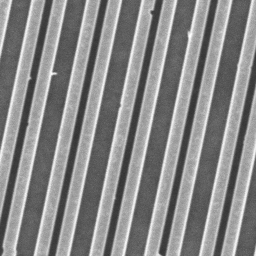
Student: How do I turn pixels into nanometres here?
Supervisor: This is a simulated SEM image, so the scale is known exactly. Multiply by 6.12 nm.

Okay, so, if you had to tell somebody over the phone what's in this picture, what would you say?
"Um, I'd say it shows parallel lines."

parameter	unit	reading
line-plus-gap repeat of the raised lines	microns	0.164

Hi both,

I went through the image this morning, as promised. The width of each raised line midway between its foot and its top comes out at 0.0749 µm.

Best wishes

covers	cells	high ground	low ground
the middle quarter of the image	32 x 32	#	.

..###...###.....###...###.....##
..###...###.....###..####.....##
..###..###......###..###......##
..###..###......###..###.....###
..###..###.....####..###.....###
.###...###.....###...###.....###
.###...###.....###..###......###
.###..###......###..###......###
.###..###......###..###.....###.
.###..###.....###...###.....###.
###...###.....###...###.....###.
###...###.....###..###......###.
###..###......###..###.....####.
###..###......###..###.....###..
###..###.....###...###.....###..
##...###.....###...###.....###..
##...###.....###..###......###..
##..###......###..###.....####..
##..###......###..###.....###...
##..###.....###...###.....###..#
#...###.....###...###.....###..#
#..####.....###..###......###..#
#..###......###..###.....###...#
#..###......###..###.....###...#
#..###.....###...###.....###..##
...###.....###..####.....###..##
..####.....###..###......###..##
..###......###..###.....###...##
..###......###..###.....###...##
..###.....###...###.....###..###
..###.....###...###.....###..###
.###......###..###......###..###